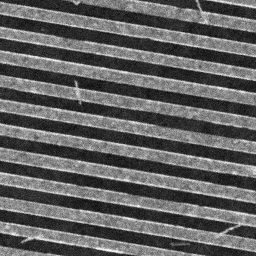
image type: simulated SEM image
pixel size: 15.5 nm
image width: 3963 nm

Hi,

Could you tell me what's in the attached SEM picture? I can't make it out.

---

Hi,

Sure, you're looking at parallel lines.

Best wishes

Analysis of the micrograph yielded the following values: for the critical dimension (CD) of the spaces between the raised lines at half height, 0.204 µm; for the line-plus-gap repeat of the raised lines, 0.371 µm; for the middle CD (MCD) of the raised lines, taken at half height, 0.174 micrometres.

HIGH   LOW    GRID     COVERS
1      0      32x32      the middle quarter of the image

11111100000000000000000000001111
11111111111100000000000000000000
01111111111111111000000000000000
00000001111111111111111000000000
00000000000001111111111111111000
00000000000000000001111111111111
11110000000000000000000001111111
11111111110000000000000000000001
00111111111111110000000000000000
00000000111111111111111100000000
00000000000001111111111111110000
00000000000000000001111111111111
11111000000000000000000001111111
11111111111000000000000000000001
11111111111111111000000000000000
00000000111111111111111000000000
00000000000011111111111111111000
00000000000000000011111111111111
11110000000000000000000011111111
11111111110000000000000000000011
01111111111111110000000000000000
00000001111111111111110000000000
00000000000001111111111111110000
00000000000000000001111111111111
11110000000000000000000001111111
11111111110000000000000000000001
11111111111111110000000000000000
00000011111111111111110000000000
00000000000011111111111111110000
00000000000000000011111111111111
11100000000000000000000011111111
11111111100000000000000000000011